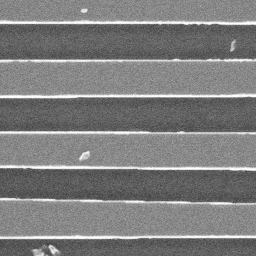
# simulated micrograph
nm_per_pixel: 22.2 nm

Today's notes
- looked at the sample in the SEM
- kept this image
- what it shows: lines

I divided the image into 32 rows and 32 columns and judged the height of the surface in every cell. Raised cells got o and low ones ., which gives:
oooooooooooooooooooooooooooooooo
oooooooooooooooooooooooooooooooo
oooooooooooooooooooooooooooooooo
................................
................................
................................
................................
................................
oooooooooooooooooooooooooooooooo
oooooooooooooooooooooooooooooooo
oooooooooooooooooooooooooooooooo
oooooooooooooooooooooooooooooooo
................................
................................
................................
................................
................................
oooooooooooooooooooooooooooooooo
oooooooooooooooooooooooooooooooo
oooooooooooooooooooooooooooooooo
oooooooooooooooooooooooooooooooo
................................
................................
................................
................................
ooooooooooooooooooooooooooooo...
oooooooooooooooooooooooooooooooo
oooooooooooooooooooooooooooooooo
oooooooooooooooooooooooooooooooo
oooooooooooooooooooooooooooooooo
................................
................................